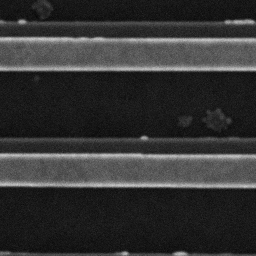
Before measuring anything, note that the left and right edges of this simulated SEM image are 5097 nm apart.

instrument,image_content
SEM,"lines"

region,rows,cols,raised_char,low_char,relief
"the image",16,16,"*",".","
................
................
****************
****************
................
................
................
................
................
................
****************
****************
................
................
................
................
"